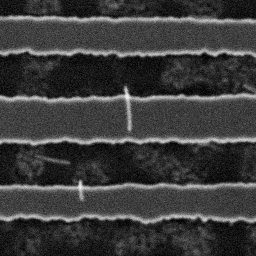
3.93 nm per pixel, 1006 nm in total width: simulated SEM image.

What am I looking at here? lines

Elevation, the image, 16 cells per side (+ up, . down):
................
++++++++++++++++
++++++++++++++++
................
................
................
++++++++++++++++
++++++++++++++++
++++++++++++++++
................
................
...............+
++++++++++++++++
++++++++++++++++
................
................